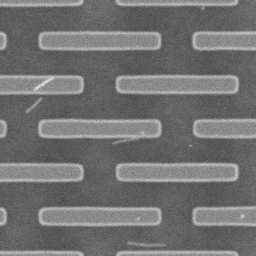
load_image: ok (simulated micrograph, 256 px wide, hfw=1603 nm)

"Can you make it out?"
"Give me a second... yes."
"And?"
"groups of lines, slits or small figures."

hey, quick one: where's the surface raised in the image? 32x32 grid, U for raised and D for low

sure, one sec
UUUUUUUUUUDDDDDUUUUUUUUUUUUUUDDD
DDDDDDDDDDDDDDDDDDDDDDDDDDDDDDDD
DDDDDDDDDDDDDDDDDDDDDDDDDDDDDDDD
DDDDDDDDDDDDDDDDDDDDDDDDDDDDDDDD
UDDDDUUUUUUUUUUUUUUUDDDDUUUUUUUU
UDDDDUUUUUUUUUUUUUUUDDDDUUUUUUUU
DDDDDDDDDDDDDDDDDDDDDDDDDDDDDDDD
DDDDDDDDDDDDDDDDDDDDDDDDDDDDDDDD
DDDDDDDDDDDDDDDDDDDDDDDDDDDDDDDD
UDDDDDDDDDDDDDDDDDUUUUUUUDDUUDDD
UUUUUUUUUUDDDDDUUUUUUUUUUUUUUUDD
UUUUUUUUUUDDDDDUUUUUUUUUUUUUUDDD
DDDDDDDDDDDDDDDDDDDDDDDDDDDDDDDD
DDDDDDDDDDDDDDDDDDDDDDDDDDDDDDDD
DDDDDDDDDDDDDDDDDDDDDDDDDDDDDDDD
UDDDDUUUUUUUUUUUUUUUDDDDUUUUUUUU
UDDDDUUUUUUUUUUUUUUUDDDDUUUUUUUU
DDDDDDDDDDDDDDDDDDDDDDDDDDDDDDDD
DDDDDDDDDDDDDDDDDDDDDDDDDDDDDDDD
DDDDDDDDDDDDDDDDDDDDDDDDDDDDDDDD
DDDDDDDDDDDDDDDDUUUDDDDUUUUUDDDD
UUUUUUUUUUDDDDDUUUUUUUUUUUUUUUDD
UUUUUUUUUUDDDDDUUUUUUUUUUUUUUDDD
DDDDDDDDDDDDDDDDDDDDDDDDDDDDDDDD
DDDDDDDDDDDDDDDDDDDDDDDDDDDDDDDD
DDDDDDDDDDDDDDDDDDDDDDDDDDDDDDDD
UDDDDUUUUUUUUUUUUUUUDDDDUUUUUUUU
UDDDDUUUUUUUUUUUUUUUDDDDUUUUUUUU
DDDDDDDDDDDDDDDDDDDDDDDDDDDDDDDD
DDDDDDDDDDDDDDDDDDDDDDDDDDDDDDDD
DDDDDDDDDDDDDDDDDDDDDDDDDDDDDDDD
DDDDUUUUUDDDDDDDDUUUUUUUUUUUUDDD